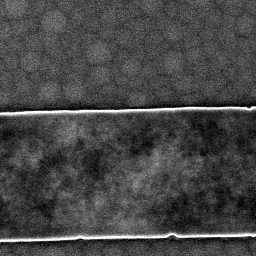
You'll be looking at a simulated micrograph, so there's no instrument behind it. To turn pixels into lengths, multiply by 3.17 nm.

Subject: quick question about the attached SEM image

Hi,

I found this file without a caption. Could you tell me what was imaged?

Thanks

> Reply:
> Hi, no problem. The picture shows one or a few lines or trenches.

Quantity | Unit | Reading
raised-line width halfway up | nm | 407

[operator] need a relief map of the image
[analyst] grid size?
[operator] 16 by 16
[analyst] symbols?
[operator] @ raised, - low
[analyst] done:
----------------
----------------
----------------
----------------
----------------
----------------
----------------
@@@@@@@@@@@@@@@@
@@@@@@@@@@@@@@@@
@@@@@@@@@@@@@@@@
@@@@@@@@@@@@@@@@
@@@@@@@@@@@@@@@@
@@@@@@@@@@@@@@@@
@@@@@@@@@@@@@@@@
@@@@@@@@@@@@@@@@
----------------